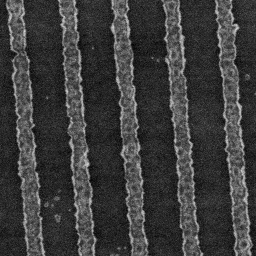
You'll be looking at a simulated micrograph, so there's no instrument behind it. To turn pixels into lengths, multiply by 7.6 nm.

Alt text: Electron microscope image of parallel lines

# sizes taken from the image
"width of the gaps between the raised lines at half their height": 284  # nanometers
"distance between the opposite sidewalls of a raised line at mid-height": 110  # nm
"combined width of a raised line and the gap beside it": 395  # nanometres